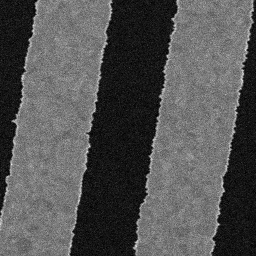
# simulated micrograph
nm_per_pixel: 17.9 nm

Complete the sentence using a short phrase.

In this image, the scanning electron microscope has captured one or a few lines or trenches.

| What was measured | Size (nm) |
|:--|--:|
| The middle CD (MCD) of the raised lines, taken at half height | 1340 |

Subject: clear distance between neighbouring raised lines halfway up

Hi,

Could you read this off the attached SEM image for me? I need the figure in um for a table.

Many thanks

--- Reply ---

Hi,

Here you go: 1.15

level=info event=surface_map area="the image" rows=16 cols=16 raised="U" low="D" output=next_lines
DDUUUUUDDDDUUUUU
DDUUUUUDDDDUUUUU
DDUUUUUDDDDUUUUU
DDUUUUDDDDUUUUUD
DUUUUUDDDDUUUUUD
DUUUUUDDDDUUUUUD
DUUUUUDDDDUUUUUD
DUUUUUDDDDUUUUUD
DUUUUUDDDDUUUUUD
DUUUUDDDDUUUUUDD
DUUUUDDDDUUUUUDD
UUUUUDDDDUUUUUDD
UUUUUDDDDUUUUUDD
UUUUUDDDDUUUUUDD
UUUUUDDDDUUUUDDD
UUUUDDDDUUUUUDDD